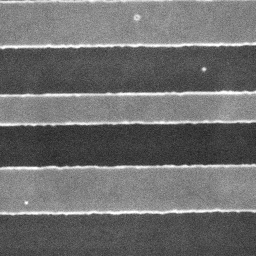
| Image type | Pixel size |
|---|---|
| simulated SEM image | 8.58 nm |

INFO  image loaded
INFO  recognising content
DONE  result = lines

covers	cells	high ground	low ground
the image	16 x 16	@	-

@@@@@@@@@@@@@@@@
@@@@@@@@@@@@@@@@
@@@@@@@@@@@@@@@@
----------------
----------------
----------------
@@@@@@@@@@@@@@@@
@@@@@@@@@@@@@@@@
----------------
----------------
@@@@@@@@@@@@@@@@
@@@@@@@@@@@@@@@@
@@@@@@@@@@@@@@@@
----------------
----------------
----------------